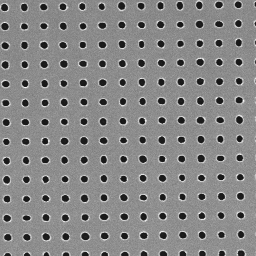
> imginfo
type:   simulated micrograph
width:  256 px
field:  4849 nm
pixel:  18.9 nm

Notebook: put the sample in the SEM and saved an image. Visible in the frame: a regular array of holes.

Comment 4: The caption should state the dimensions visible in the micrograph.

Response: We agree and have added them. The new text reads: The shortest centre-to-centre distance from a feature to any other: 359 nm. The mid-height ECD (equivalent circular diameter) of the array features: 6.86 pixels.